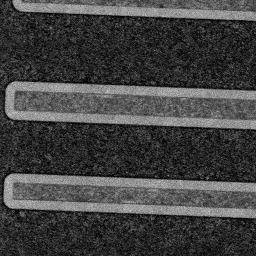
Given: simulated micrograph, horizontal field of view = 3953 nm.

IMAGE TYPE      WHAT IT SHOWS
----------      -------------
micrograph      one or a few lines or trenches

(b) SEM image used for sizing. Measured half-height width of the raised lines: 407 nanometres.